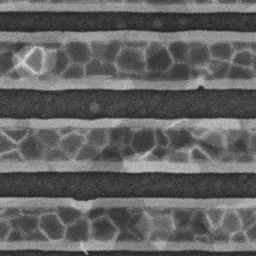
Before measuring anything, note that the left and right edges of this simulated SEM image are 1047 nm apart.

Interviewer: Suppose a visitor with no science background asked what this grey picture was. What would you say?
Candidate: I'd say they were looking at one or a few lines or trenches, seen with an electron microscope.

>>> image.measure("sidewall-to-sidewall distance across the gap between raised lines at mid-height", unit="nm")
137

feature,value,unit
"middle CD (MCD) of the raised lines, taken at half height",191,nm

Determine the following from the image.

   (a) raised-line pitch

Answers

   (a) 0.336 µm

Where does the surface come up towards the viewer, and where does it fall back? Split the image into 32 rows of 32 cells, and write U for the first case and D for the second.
UUUUUUUUUUUUUUUUUUUUUUUUUUUUUUUU
DDDDDDDDDDDDDDDDDDDDDDDDDDDDDDDD
DDDDDDDDDDDDDDDDDDDDDDDDDDDDDDDD
DDDDDDDDDDDDDDDDDDDDDDDDDDDDDDDD
DUDDDDDDUUDUUUUUUUUDDDDUUUUUUUDD
UUUUUUUUUUUUUUUUUUUUUUUUUUUUUUUU
UUUUUUUUUUUUUUUUUUUUUUUUUUUUUUUU
UUUUUUUUUUUUUUUUUUUUUUUUUUUUUUUU
UUUUUUUUUUUUUUUUUUUUUUUUUUUUUUUU
UUUUUUUUUUUUUUUUUUUUUUUUUUUUUUUU
UUDUUUUUUUUDDUUUUUUUUUUUUUUUUUUU
DDDDDDDDDDDDDDDDDDDDDDDDDDDDDDDD
DDDDDDDDDDDDDDDDDDDDDDDDDDDDDDDD
DDDDDDDDDDDDDDDDDDDDDDDDDDDDDDDD
DDDDDDDDDDDDDDDDDDDDDDDDDDDDDDDD
UUUUUUUUUUUUUUUUUUUUUUUUUUUUUUUU
UUUUUUUUUUUUUUUUUUUUUUUUUUUUUUUU
UUUUUUUUUUUUUUUUUUUUUUUUUUUUUUUU
UUUUUUUUUUUUUUUUUUUUUUUUUUUUUUUU
UUUUUUUUUUUUUUUUUUUUUUUUUUUUUUUU
UUUUUUUUUUUUUUUUUUUUUUUUUUUUUUUU
DDDDDDDDDDDDDDDDDDDDDDDDDDDDDDDD
DDDDDDDDDDDDDDDDDDDDDDDDDDDDDDDD
DDDDDDDDDDDDDDDDDDDDDDDDDDDDDDDD
DDDDDDDDDDDDDDDDDDDDDDDDDDDDDDDD
UUUUUUUUUUDUUUUUUUUUUUUUUUUUUUUU
UUUUUUUUUUUUUUUUUUUUUUUUUUUUUUUU
UUUUUUUUUUUUUUUUUUUUUUUUUUUUUUUU
UUUUUUUUUUUUUUUUUUUUUUUUUUUUUUUU
UUUUUUUUUUUUUUUUUUUUUUUUUUUUUUUU
UUUUUUUUUUUUUUUUUUUUUUUUUUUUUUUU
DDDDDDDDDDDDDDDDDDDDDDDDDDDDDDDD